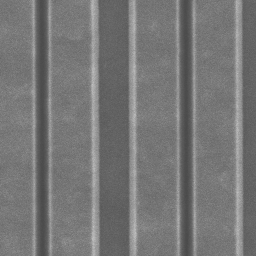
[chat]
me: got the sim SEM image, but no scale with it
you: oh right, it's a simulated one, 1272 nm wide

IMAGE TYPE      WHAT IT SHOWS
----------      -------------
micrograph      one or a few lines or trenches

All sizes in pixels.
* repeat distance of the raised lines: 72